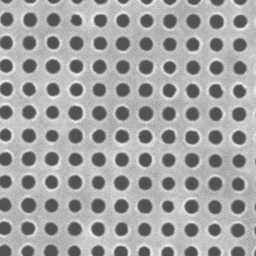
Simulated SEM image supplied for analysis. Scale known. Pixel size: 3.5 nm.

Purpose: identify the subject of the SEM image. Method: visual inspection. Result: a regular array of holes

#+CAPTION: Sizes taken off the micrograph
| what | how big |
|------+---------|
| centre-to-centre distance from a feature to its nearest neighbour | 0.0803 micrometres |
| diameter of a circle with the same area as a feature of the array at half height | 45.9 nm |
